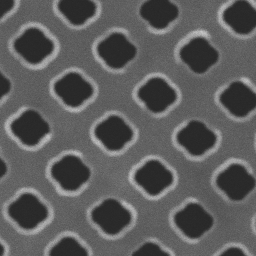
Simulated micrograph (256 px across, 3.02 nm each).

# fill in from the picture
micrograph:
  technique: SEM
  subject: a regular array of holes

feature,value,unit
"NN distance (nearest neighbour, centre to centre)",175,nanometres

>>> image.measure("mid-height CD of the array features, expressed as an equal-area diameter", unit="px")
34.9